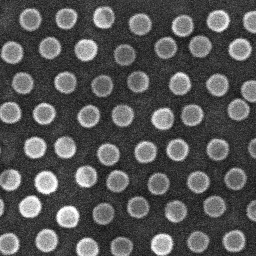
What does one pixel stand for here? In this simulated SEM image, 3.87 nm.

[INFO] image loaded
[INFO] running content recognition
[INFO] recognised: a regular array of raised bodies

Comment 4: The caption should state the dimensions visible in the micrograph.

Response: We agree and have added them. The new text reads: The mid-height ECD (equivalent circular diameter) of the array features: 80.1 nanometres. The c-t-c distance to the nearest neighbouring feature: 126 nanometers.